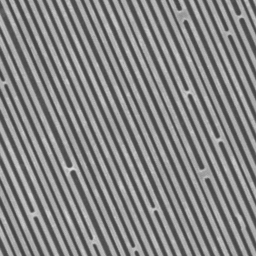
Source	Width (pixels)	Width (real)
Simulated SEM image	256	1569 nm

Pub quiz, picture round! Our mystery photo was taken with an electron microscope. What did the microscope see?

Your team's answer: parallel lines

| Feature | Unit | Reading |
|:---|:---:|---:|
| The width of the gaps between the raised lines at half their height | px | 3.78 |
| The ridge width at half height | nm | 28.8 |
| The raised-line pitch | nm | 53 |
